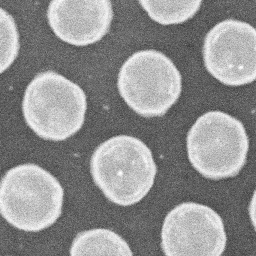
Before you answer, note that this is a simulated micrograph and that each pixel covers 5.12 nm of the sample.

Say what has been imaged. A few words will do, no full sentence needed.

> raised bodies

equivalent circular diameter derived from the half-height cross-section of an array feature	322	nm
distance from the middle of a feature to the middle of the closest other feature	0.465	microns